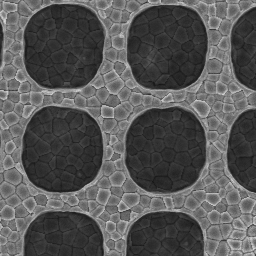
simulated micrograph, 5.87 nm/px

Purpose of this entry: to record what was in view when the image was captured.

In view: holes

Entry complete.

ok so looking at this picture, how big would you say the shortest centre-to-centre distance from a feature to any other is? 604 nanometres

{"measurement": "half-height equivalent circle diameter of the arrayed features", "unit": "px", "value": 86.7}